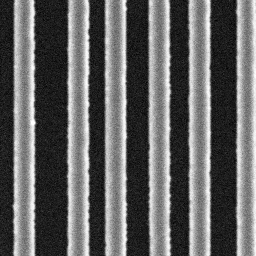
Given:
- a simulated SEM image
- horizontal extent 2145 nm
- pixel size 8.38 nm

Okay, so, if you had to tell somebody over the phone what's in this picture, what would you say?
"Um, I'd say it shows lines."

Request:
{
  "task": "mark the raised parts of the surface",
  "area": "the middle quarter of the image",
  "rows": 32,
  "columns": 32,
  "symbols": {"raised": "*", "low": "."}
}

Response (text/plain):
.*****....******.....*****......
.*****....*****......*****......
.*****....*****......*****......
.*****....*****......*****......
.*****....*****......*****......
.*****....*****......*****......
.*****....*****......*****......
.*****....*****......*****......
.*****....*****......*****.....*
.*****....******.....*****.....*
.*****....*****.......****......
.*****....*****......*****......
.*****....*****.......****......
.*****....*****......*****......
.*****....*****......*****......
.*****....*****.......****......
.*****....*****......*****......
.*****....******.....*****......
.*****.....*****.....*****......
.*****....*****.......****.....*
.*****....*****.......****......
.*****....*****......*****......
.*****....*****......*****......
.*****....*****......*****......
.*****....*****......*****......
.*****....*****......*****......
.*****....*****......*****......
.*****....*****......*****......
.*****....******......****......
.*****....*****......*****......
.*****....*****.......****......
.*****.....*****......****......